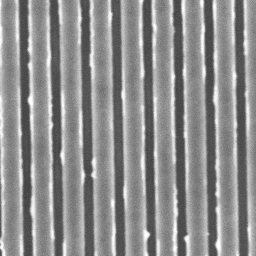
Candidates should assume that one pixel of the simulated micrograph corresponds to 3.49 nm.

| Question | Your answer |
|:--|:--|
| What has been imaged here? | parallel lines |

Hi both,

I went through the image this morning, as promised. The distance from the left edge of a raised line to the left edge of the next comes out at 107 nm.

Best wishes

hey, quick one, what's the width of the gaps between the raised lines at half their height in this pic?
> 9.48 pixels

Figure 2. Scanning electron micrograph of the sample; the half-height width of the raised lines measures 20.9 pixels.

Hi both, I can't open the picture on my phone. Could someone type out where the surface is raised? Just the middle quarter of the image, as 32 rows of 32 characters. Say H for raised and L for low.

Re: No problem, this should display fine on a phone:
HHHHLLLHHHHHLLLHHHHHLLHHHHHLLLHH
HHHHLLLHHHHHLLLHHHHHLLHHHHHLLLHH
HHHHLLLHHHHHLLLHHHHHLLHHHHHHLLHH
HHHHLLLHHHHHLLHHHHHHLLHHHHHHLLHH
HHHHLLLHHHHHLLLHHHHHLLLHHHHLLLHH
HHHHLLLHHHHHLLLHHHHHLLLHHHHHLLHH
HHHHLLLHHHHHLLLHHHHHLLLHHHHHLLHH
HHHHLLLHHHHHLLLHHHHHLLLHHHHLLLHH
HHHHLLLHHHHHLLLHHHHHLLLHHHHHLLHH
HHHHLLLHHHHHLLLHHHHHLLLHHHHHLLHH
HHHHLLLHHHHHLLLHHHHHLLLHHHHHLLHH
HHHHLLLHHHHHLLLHHHHHLLLHHHHHLLHH
HHHHLLLHHHHHLLLHHHHHLLLHHHHHLLHH
HHHHLLLHHHHHLLLHHHHHLLLHHHHHLLHH
HHHHLLLHHHHHLLLHHHHHLLLHHHHHLLHH
HHHHLLLHHHHHLLLHHHHHLLLHHHHLLLHH
HHHHLLLHHHHHLLLHHHHHLLLHHHHHLLHH
HHHHHLLHHHHHLLLHHHHHLLLHHHHHLLHH
HHHHHLLHHHHHLLLHHHHHLLLHHHHHLLHH
HHHHHLLHHHHHLLLHHHHHLLLHHHHHLLHH
HHHHHLLHHHHHLLLHHHHHLLLHHHHHLLHH
HHHHHLLHHHHHLLLHHHHHLLLHHHHHLLHH
HHHHHLLHHHHHLLLHHHHHLLLHHHHHLLHH
HHHHHLLHHHHHLLLHHHHHLLLHHHHHLLHH
HHHHHLLHHHHHLLLHHHHHLLLHHHHHLLHH
HHHHHLLHHHHHLLLHHHHHLLLHHHHHLLHH
HHHHHLLHHHHHLLLHHHHHLLLHHHHHLLLH
HHHHHLLHHHHHHLLHHHHHLLLHHHHHLLLH
HHHHHLLHHHHHHLLHHHHHLLLHHHHHLLLH
HHHHHLLLHHHHHLLHHHHHLLLHHHHHLLLH
HHHHHLLLHHHHHLLHHHHHLLLHHHHHLLLH
HHHHHLLHHHHHHLLHHHHHLLLHHHHHLLLH